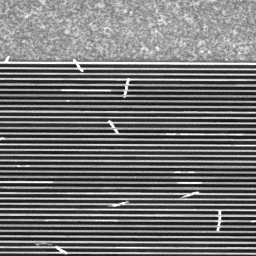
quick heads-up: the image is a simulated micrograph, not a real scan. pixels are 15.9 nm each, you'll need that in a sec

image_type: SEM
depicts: parallel lines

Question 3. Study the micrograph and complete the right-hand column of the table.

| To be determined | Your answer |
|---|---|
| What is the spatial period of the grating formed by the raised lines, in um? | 0.0865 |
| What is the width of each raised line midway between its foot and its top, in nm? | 27.9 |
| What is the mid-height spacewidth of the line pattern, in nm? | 57.8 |